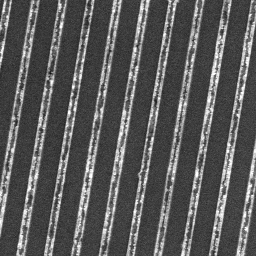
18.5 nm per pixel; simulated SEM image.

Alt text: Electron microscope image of parallel lines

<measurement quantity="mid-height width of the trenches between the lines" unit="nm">373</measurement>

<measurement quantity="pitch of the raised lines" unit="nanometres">502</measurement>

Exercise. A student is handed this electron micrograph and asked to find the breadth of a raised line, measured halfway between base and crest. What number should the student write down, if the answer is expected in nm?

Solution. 119